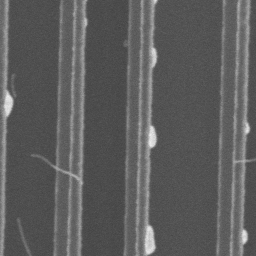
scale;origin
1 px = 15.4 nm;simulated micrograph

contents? lines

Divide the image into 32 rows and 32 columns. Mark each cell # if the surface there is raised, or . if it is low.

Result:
#.......###.....###.........###.
#.......###.....###.........###.
#.......###.....###.........###.
#.......###.....###.........###.
#.......###.....###.........###.
#.......##......###.........###.
#.......##......###.........###.
#......###......###.........###.
#......###......###.........###.
#......###......###.........###.
#......###......###.........###.
#......###......###.........###.
##.....###......###.........###.
#......###......###.........###.
#......###......###.........###.
#......###......###.........###.
#......###......###.........###.
#......###......###........####.
#......###......###........####.
#......###......###........####.
#......###......###........####.
#......###......###........####.
#......###......###........###..
#......###......##.........####.
.......###......##.........####.
.......###......##.........###..
.......###......##.........###..
.......###......##.........###..
.......###......###........####.
.......###......###........####.
.......###......###........####.
.......###......###........###..